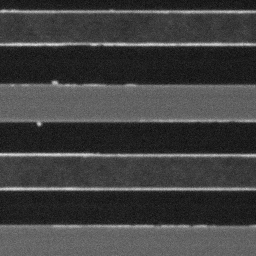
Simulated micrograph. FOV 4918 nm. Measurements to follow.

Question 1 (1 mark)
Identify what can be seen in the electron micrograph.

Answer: lines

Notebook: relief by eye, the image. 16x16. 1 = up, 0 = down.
0000000000000000
1111111111111111
1111111111111111
0000000000000000
0000000000000000
1111111111111111
1111111111111111
1111111111111111
0000000000000000
0000000000000000
1111111111111111
1111111111111111
0000000000000000
0000000000000000
1111111111111111
1111111111111111